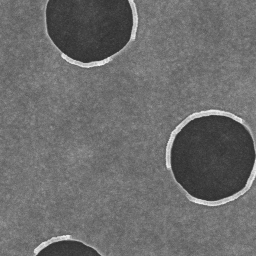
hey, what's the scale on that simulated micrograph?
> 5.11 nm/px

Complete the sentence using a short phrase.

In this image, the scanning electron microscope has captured holes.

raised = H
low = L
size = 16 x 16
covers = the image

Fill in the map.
HHHLLLLLHHHHHHHH
HHHLLLLLHHHHHHHH
HHHLLLLLHHHHHHHH
HHHHLLLHHHHHHHHH
HHHHHHHHHHHHHHHH
HHHHHHHHHHHHHHHH
HHHHHHHHHHHHHHHH
HHHHHHHHHHHHLLLH
HHHHHHHHHHHLLLLL
HHHHHHHHHHHLLLLL
HHHHHHHHHHHLLLLL
HHHHHHHHHHHLLLLH
HHHHHHHHHHHHHLHH
HHHHHHHHHHHHHHHH
HHHHHHHHHHHHHHHH
HHHLLLHHHHHHHHHH